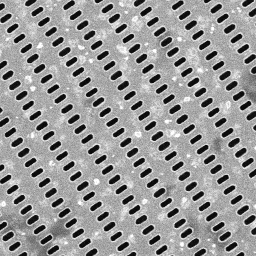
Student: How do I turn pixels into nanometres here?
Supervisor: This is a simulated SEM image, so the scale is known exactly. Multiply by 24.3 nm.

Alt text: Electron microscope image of a regular array of holes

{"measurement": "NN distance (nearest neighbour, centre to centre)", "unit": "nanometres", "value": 292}